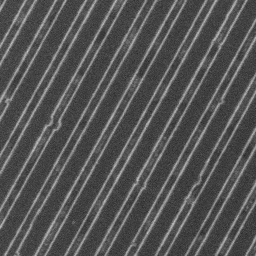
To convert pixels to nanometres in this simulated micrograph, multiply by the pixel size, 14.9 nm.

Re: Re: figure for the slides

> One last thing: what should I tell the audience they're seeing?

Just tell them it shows parallel lines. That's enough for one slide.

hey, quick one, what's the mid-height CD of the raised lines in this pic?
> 129 nm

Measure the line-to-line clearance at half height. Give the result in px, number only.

18.2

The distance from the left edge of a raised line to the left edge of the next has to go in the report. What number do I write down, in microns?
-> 0.393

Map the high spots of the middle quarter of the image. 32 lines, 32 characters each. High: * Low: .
....**.....***.....**.....***...
...***.....**......**.....**....
...**.....***.....**.....***....
..***.....**.....***.....**.....
..**.....***.....**.....***.....
.***.....**.....***.....**.....*
.**.....**......**.....***.....*
***.....**.....***.....**.....**
**.....**......**.....**......**
*.....***.....**......**.....***
*.....**......**.....**......**.
.....***.....**.....***.....**..
.....**.....***.....**......**..
....***.....**.....***.....**...
....**.....***.....**.....***...
...**......**.....***.....**....
...**.....***.....**.....***....
..**......**.....**......**.....
.***.....***.....**.....***.....
.**......**.....**......**.....*
***.....**.....***.....**......*
**.....***.....**......**.....**
**.....**.....***.....**.....***
*.....***.....**.....***.....**.
*.....**.....***.....**.....***.
.....***.....**.....***.....**..
.....**.....**......**.....***..
....***.....**.....***.....**...
....**.....**......**.....**....
...**.....***.....**......**....
...**.....**......**.....**.....
..**.....***.....**.....***.....